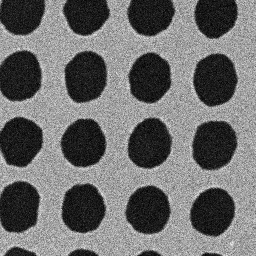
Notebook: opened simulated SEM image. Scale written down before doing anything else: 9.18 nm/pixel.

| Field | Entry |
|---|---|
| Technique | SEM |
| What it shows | a regular array of holes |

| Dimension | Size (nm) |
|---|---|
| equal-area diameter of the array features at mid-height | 435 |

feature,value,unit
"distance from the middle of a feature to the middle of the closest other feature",594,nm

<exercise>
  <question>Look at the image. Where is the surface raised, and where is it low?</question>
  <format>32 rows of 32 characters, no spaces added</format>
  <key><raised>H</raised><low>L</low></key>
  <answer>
LLLLLLHHLLLLLHHHLLLLLLHHHLLLLLHH
LLLLLLHHLLLLLLHHLLLLLLHHLLLLLLHH
LLLLLHHHLLLLLHHHLLLLLLHHLLLLLLHH
HLLLLHHHHLLLLHHHHLLLLHHHHLLLLHHH
HHHHHHHHHHHHHHHHHHLHHHHHHHLLHHHH
HHHHHHHHHHHHHHHHHHHHHHHHHHHHHHHH
HHLLHHHHHHLLHHHHHHHHHHHHHHHHHHHH
LLLLLHHHHLLLLHHHHLLLLHHHHLLLLHHH
LLLLLHHHLLLLLHHHLLLLLHHHLLLLLHHH
LLLLLHHHLLLLLHHHLLLLLHHHLLLLLLHH
LLLLLHHHLLLLLHHHLLLLLHHHLLLLLLHH
LLLLLHHHLLLLLHHHLLLLLHHHLLLLLHHH
HLLHHHHHHLLLHHHHHLLLHHHHHLLLLHHH
HHHHHHHHHHHHHHHHHHHHHHHHHHHHHHHH
HHHHHHHHHHHHHHHHHHHHHHHHHHHHHHHH
HLLLLHHHHLLLHHHHHLLLLHHHHLLLLHHH
LLLLLHHHLLLLLHHHLLLLLHHHLLLLLHHH
LLLLLHHHLLLLLHHHLLLLLHHHLLLLLLHH
LLLLLHHHLLLLLHHHLLLLLHHHLLLLLLHH
LLLLHHHHLLLLLHHHLLLLLHHHLLLLLHHH
HLLLHHHHHLLLHHHHHLLLHHHHHLLLHHHH
HHHHHHHHHHHHHHHHHHHHHHHHHHHHHHHH
HHHHHHHHHHHHHHHHHHHHHHHHHHHHHHHH
HLLLHHHHHLLLHHHHHLLLHHHHHHHHHHHH
LLLLLHHHLLLLLHHHLLLLLHHHHLLLLHHH
LLLLLHHHLLLLLHHHLLLLLHHHLLLLLHHH
LLLLLHHHLLLLLHHHLLLLLHHHLLLLLHHH
LLLLLHHHLLLLLHHHLLLLLHHHLLLLLHHH
LLLLHHHHHLLLHHHHHLLLHHHHLLLLLHHH
HHHHHHHHHHHHHHHHHHHHHHHHHHLHHHHH
HHHHHHHHHHHHHHHHHHHHHHHHHHHHHHHH
HLLLHHHHHLLLHHHHHHLLHHHHHHHHHHHH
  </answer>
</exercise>